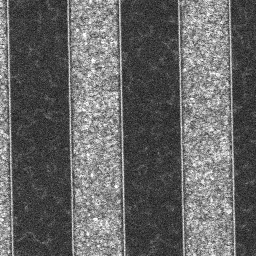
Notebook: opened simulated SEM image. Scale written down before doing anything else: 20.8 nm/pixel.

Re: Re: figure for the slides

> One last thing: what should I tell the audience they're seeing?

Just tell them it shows one or a few lines or trenches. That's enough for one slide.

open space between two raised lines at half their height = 1.07 micrometres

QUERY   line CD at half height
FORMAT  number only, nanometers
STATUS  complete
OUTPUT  1240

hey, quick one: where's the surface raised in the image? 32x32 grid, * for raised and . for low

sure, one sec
.********......*******.......***
.*******.......*******.......***
.********......*******.......***
.********......*******.......***
.********......*******.......***
.********......*******.......***
.********......*******.......***
.********......*******.......***
.********......*******.......***
.********......********......***
.********......*******.......***
.********......*******.......***
.********......*******.......***
.********......********......***
.********......********......***
.********......********......***
.********......********......***
.********......********......***
.********......********......***
.********......********......***
.********......********......***
.********......********......***
.********......********......***
.********......********......***
..*******.......*******......***
..*******.......*******......***
..*******.......*******......***
..*******.......*******......***
..*******.......*******......***
..*******.......*******......***
..*******.......*******......***
..*******.......*******......***